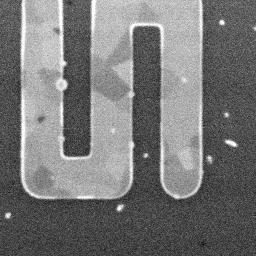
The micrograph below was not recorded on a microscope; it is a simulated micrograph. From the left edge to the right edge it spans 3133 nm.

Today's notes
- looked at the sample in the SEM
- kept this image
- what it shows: groups of lines, slits or small figures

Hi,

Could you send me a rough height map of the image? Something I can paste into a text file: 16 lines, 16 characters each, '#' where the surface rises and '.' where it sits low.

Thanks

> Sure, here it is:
..##..#######...
..##..#######...
.###..##..###...
.###..##..###...
.###..##..###...
.###..##..###...
.###..##..###...
.###..##..###...
.###..##..###...
.###..##..###...
.#######..###...
..######..##....
................
................
................
................